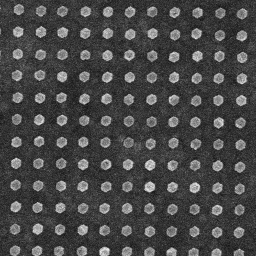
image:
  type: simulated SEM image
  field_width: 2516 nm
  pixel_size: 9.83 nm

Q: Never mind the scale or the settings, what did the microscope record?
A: a regular array of raised bodies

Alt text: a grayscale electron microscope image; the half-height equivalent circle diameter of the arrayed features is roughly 97.9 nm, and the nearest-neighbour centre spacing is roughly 208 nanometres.